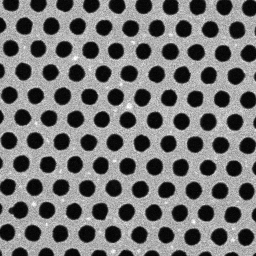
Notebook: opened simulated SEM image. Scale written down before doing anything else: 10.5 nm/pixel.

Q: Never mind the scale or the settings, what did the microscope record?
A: a regular array of holes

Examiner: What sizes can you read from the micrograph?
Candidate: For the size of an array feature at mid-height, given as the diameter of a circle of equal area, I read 0.177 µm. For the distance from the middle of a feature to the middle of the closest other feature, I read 274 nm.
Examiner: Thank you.